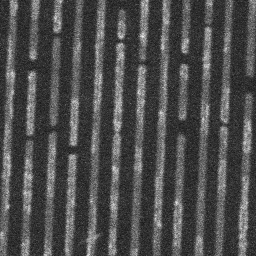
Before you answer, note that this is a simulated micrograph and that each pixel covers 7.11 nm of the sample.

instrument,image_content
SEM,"parallel lines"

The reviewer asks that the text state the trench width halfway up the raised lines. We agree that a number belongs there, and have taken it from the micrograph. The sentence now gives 16 pixels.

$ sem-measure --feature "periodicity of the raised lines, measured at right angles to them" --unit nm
154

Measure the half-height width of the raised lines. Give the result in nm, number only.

39.9